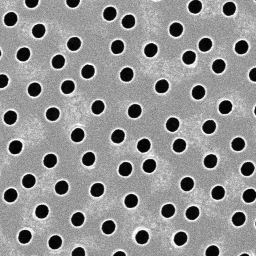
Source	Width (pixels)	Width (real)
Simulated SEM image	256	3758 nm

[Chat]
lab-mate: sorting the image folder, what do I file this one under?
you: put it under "a regular array of holes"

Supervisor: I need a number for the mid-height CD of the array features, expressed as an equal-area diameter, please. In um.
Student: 0.207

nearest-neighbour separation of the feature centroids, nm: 418